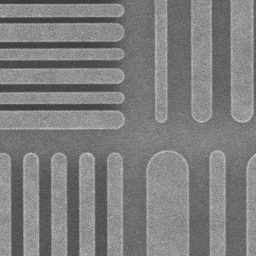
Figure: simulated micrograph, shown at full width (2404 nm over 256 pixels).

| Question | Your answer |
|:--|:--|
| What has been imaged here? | groups of lines, slits or small figures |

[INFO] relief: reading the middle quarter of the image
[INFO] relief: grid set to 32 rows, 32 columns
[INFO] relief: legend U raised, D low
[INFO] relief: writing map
DDDDDDDDDDDDDDDDDDDDDDDUUUDDDDDD
UUUUUUUUUUUUUUDDDDDDDDDUUUDDDDDD
UUUUUUUUUUUUUUUDDDDDDDDUUUDDDDDD
UUUUUUUUUUUUUUUDDDDDDDDUUUDDDDDD
UUUUUUUUUUUUUUDDDDDDDDDUUUDDDDDD
DDDDDDDDDDDDDDDDDDDDDDDUUUDDDDDD
DDDDDDDDDDDDDDDDDDDDDDDUUUDDDDDD
UUUUUUUUUUUUUUUDDDDDDDDUUUDDDDDD
UUUUUUUUUUUUUUUDDDDDDDDUUUDDDDDD
UUUUUUUUUUUUUUUDDDDDDDDUUUDDDDDD
DDDDDDDDDDDDDDDDDDDDDDDUUUDDDDDD
DDDDDDDDDDDDDDDDDDDDDDDUUUDDDDDD
UUUUUUUUUUUUUUUDDDDDDDDUUUDDDDDD
UUUUUUUUUUUUUUUDDDDDDDDUUUDDDDDD
UUUUUUUUUUUUUUUDDDDDDDDDUDDDDDDD
UUUUUUUUUUUUUUUDDDDDDDDDDDDDDDDD
DDDDDDDDDDDDDDDDDDDDDDDDDDDDDDDD
DDDDDDDDDDDDDDDDDDDDDDDDDDDDDDDD
DDDDDDDDDDDDDDDDDDDDDDDDDDDDDDDD
DDDDDDDDDDDDDDDDDDDDDDDDDDDDDDDD
DDDDDDDDDDDDDDDDDDDDDDDDDDDDDDDD
DDDDDDDDDDDDDDDDDDDDDDDDDDDDDDDD
DDDDDUUDDDDDUUDDDDDDDDDUUUUUUDDD
DDDDUUUDDDDUUUDDDDDDDDUUUUUUUUDD
DDDDUUUDDDDUUUUDDDDDDUUUUUUUUUDD
DDDDUUUDDDDUUUUDDDDDDUUUUUUUUUUD
DDDDUUUDDDDUUUUDDDDDDUUUUUUUUUUD
DDDDUUUDDDDUUUUDDDDDDUUUUUUUUUUD
DDDDUUUDDDDUUUUDDDDDDUUUUUUUUUUD
DDDDUUUDDDDUUUUDDDDDDUUUUUUUUUUD
DDDDUUUDDDDUUUUDDDDDDUUUUUUUUUUD
DDDDUUUDDDDUUUUDDDDDDUUUUUUUUUUD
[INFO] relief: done